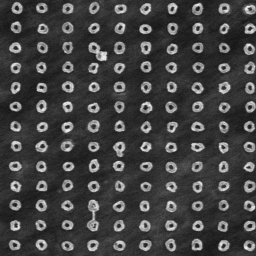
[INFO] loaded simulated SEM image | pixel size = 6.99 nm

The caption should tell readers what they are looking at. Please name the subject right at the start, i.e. a regular array of ring-shaped raised bodies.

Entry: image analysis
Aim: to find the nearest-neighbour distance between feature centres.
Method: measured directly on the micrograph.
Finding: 0.135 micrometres